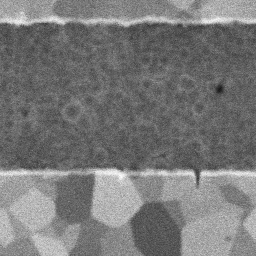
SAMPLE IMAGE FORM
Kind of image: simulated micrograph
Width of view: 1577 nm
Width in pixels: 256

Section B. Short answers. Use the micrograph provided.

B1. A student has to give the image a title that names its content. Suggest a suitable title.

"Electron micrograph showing one or a few lines or trenches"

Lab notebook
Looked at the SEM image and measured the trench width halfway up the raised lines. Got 940 nm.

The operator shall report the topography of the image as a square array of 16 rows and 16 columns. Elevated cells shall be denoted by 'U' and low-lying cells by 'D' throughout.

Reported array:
UUUUUUUUUUUUUUUU
DDDDDDDDDDDDDDDD
DDDDDDDDDDDDDDDD
DDDDDDDDDDDDDDDD
DDDDDDDDDDDDDDDD
DDDDDDDDDDDDDDDD
DDDDDDDDDDDDDDDD
DDDDDDDDDDDDDDDD
DDDDDDDDDDDDDDDD
DDDDDDDDDDDDDDDD
DDDDDDDDDDDDDDDD
UUUUUUUUUUUUUUUU
UUUUUUUUUUUUUUUU
UUUUUUUUUUUUUUUU
UUUUUUUUUUUUUUUU
UUUUUUUUUUUUUUUU